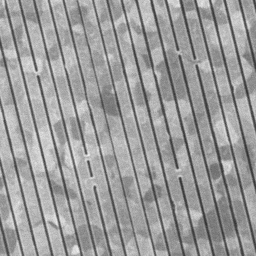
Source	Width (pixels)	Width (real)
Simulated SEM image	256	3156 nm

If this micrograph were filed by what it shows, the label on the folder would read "parallel lines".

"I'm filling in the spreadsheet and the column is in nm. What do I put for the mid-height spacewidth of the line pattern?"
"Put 41.9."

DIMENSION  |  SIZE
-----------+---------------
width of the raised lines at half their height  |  10.2 px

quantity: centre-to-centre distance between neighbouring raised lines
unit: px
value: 14.2